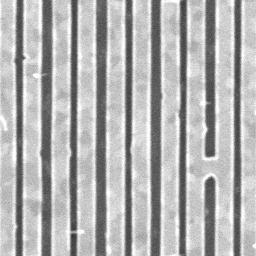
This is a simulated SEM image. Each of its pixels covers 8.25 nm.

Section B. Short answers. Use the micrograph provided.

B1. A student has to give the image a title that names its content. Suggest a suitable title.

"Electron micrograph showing parallel lines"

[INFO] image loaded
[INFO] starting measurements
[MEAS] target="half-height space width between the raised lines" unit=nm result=79.4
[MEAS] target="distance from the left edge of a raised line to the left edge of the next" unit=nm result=227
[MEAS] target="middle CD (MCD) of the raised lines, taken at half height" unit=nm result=140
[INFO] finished